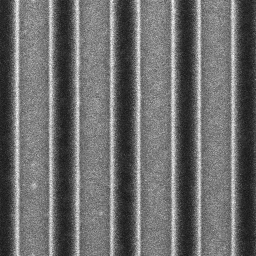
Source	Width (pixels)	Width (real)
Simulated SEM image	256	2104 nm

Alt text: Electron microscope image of one or a few lines or trenches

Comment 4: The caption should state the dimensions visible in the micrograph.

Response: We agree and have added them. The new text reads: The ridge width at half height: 233 nm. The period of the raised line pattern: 61 px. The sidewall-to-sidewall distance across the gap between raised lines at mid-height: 266 nm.